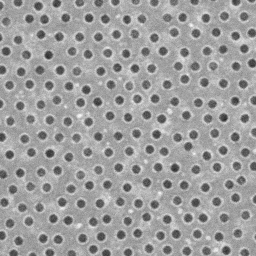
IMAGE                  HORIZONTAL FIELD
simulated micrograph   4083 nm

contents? a regular array of holes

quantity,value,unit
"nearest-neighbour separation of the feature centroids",0.261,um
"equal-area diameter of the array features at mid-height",157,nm